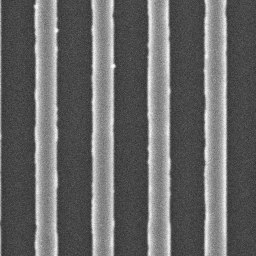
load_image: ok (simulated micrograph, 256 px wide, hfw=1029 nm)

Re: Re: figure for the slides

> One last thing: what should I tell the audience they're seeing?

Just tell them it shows lines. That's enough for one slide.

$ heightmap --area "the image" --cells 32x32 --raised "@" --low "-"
----@@@-----@@-----@@-----@@----
----@@@-----@@-----@@-----@@----
----@@@-----@@-----@@-----@@----
----@@@-----@@-----@@-----@@----
----@@@-----@@-----@@-----@@----
----@@@-----@@-----@@-----@@----
----@@@-----@@-----@@-----@@----
-----@@-----@@-----@@-----@@----
-----@@-----@@-----@@-----@@----
-----@@-----@@-----@@-----@@----
-----@@-----@@-----@@-----@@----
----@@@-----@@-----@@-----@@----
----@@@-----@@-----@@-----@@----
-----@@-----@@-----@@-----@@----
-----@@-----@@-----@@-----@@----
----@@@-----@@-----@@-----@@----
----@@@-----@@-----@@-----@@----
----@@@-----@@-----@@-----@@----
-----@@-----@@-----@@-----@@----
----@@@-----@@-----@@-----@@----
----@@@-----@@-----@@-----@@----
----@@@-----@@-----@@-----@@----
-----@@-----@@-----@@-----@@----
-----@@-----@@-----@@-----@@----
-----@@-----@@-----@@-----@@----
-----@@-----@@-----@@-----@@----
-----@@-----@@-----@@-----@@----
-----@@-----@@-----@@-----@@----
-----@@-----@@-----@@-----@@----
----@@@-----@@-----@@-----@@----
----@@@-----@@-----@@-----@@----
----@@@-----@@-----@@-----@@----